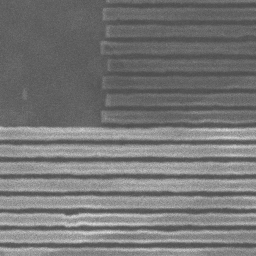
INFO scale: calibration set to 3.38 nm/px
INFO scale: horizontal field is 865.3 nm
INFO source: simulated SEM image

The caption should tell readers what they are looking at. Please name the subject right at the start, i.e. parallel lines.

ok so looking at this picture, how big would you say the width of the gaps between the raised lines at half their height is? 0.0173 um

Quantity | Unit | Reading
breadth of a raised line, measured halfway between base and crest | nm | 40.1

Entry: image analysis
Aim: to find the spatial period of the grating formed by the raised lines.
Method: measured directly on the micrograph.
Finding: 57.7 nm